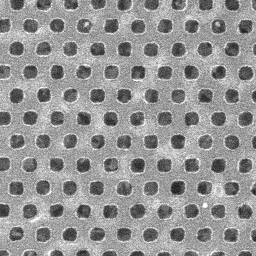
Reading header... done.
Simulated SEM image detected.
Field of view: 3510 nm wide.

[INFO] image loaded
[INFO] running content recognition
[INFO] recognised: a regular array of raised bodies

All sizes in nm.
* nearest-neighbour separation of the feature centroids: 362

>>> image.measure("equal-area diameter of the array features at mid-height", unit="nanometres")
223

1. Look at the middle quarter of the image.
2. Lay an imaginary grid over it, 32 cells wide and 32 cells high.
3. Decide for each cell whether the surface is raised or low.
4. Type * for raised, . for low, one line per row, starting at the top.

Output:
....**.....**....***....***...**
...****...****...***...****...**
...****...****...***...****...**
...***....***....***....***...**
................................
...................*............
***....***....***...***....***..
****..****...****...****...***..
****...***...****...****...***..
***....***....**....***....***..
................................
................................
...****...***....***...****...**
...****...****..****...****...**
...****...****..****...****...**
...........**....**.....*.......
................................
............................*...
***....***...****...****...***..
***....***...****...****..****..
***....***...****...***....***..
................................
................................
....**.....**.....**............
...****...****...***...****...**
...****...****...***...****...**
...***....***....***...****...**
*...............................
................................
***....***....**.....**....***..
***...****...****...****...***..
***...****...****...***....***..